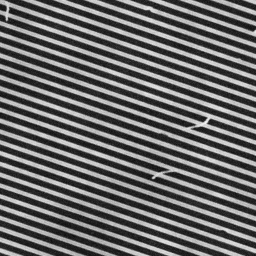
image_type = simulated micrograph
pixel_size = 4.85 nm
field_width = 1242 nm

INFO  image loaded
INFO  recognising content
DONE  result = parallel lines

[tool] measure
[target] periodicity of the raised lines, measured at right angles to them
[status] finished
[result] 49.6 nm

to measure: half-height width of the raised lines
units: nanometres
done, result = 18.9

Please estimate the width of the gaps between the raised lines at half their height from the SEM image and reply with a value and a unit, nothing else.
33.9 nanometres